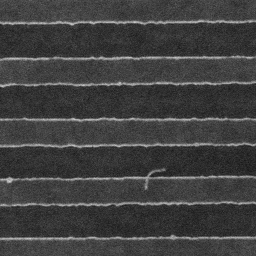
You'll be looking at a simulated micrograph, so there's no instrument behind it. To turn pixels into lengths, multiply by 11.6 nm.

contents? lines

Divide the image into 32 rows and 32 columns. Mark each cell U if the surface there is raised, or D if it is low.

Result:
UUUUUUUUUUUUUUUUUUUUUUUUUUUUUUUU
UUUUUUUUUUUUUUUUUUUUUUUUUUUUUUUU
UUUUUUUUUUUUUUUUUUUUUUUUUUUUUUUU
DDDDDDDDDDDDDDDDDDDDDDDDDDDDDDDD
DDDDDDDDDDDDDDDDDDDDDDDDDDDDDDDD
DDDDDDDDDDDDDDDDDDDDDDDDDDDDDDDD
DDDDDDDDDDDDDDDDDDDDDDDDDDDDDDDD
UUUUUUUUUUUUUUUUUUUUUUUUUUUUUUUU
UUUUUUUUUUUUUUUUUUUUUUUUUUUUUUUU
UUUUUUUUUUUUUUUUUUUUUUUUUUUUUUUU
UUUUUUUUUUUUUUUUUUUDDUUDDDUUDDDD
DDDDDDDDDDDDDDDDDDDDDDDDDDDDDDDD
DDDDDDDDDDDDDDDDDDDDDDDDDDDDDDDD
DDDDDDDDDDDDDDDDDDDDDDDDDDDDDDDD
DDDDDDDDDDDDDDDDDDDDDDDDDDDDDDDD
UUUUUUUUUUUUUUUUUUUUUUUUUUUUUUUU
UUUUUUUUUUUUUUUUUUUUUUUUUUUUUUUU
UUUUUUUUUUUUUUUUUUUUUUUUUUUUUUUU
DDDDDDDDDDDDDDDDDDDDDDDDDDDDDDDD
DDDDDDDDDDDDDDDDDDDDDDDDDDDDDDDD
DDDDDDDDDDDDDDDDDDDDDDDDDDDDDDDD
DDDDDDDDDDDDDDDDDDDDDDDDDDDDDDDD
UUUUUUUUUUUUUUUUUUUUUUUUUUUUUUUU
UUUUUUUUUUUUUUUUUUUUUUUUUUUUUUUU
UUUUUUUUUUUUUUUUUUUUUUUUUUUUUUUU
UUUUUUUUUUUUUUUUDUDUDUDUDDDDDDDD
DDDDDDDDDDDDDDDDDDDDDDDDDDDDDDDD
DDDDDDDDDDDDDDDDDDDDDDDDDDDDDDDD
DDDDDDDDDDDDDDDDDDDDDDDDDDDDDDDD
DDDDDDDDDDDDDDDDDDDDDDDDDDDDDDDD
UUUUUUUUUUUUUUUUUUUUUUUUUUUUUUUU
UUUUUUUUUUUUUUUUUUUUUUUUUUUUUUUU